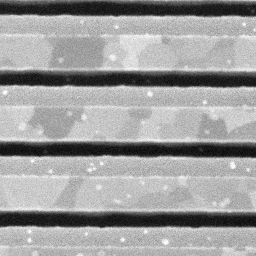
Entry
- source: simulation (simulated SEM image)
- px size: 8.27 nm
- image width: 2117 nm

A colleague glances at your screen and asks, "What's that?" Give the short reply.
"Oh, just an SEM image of lines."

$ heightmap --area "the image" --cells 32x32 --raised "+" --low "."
................................
................................
++++++++++++++++++++++++++++++++
++++++++++++++++++++++++++++++++
++++++++++++++++++++++++++++++++
++++++++++++++++++++++++++++++++
++++++++++++++++++++++++++++++++
++++++++++++++++++++++++++++++++
++++++++++++++++++++++++++++++++
................................
................................
++++++++++++++++++++++++++++++++
++++++++++++++++++++++++++++++++
++++++++++++++++++++++++++++++++
++++++++++++++++++++++++++++++++
++++++++++++++++++++++++++++++++
++++++++++++++++++++++++++++++++
++++++++++++++++++++++++++++++++
................................
................................
++++++++++++++++++++++++++++++++
++++++++++++++++++++++++++++++++
++++++++++++++++++++++++++++++++
++++++++++++++++++++++++++++++++
++++++++++++++++++++++++++++++++
++++++++++++++++++++++++++++++++
................................
................................
+++++..+..++........++..........
++++++++++++++++++++++++++++++++
++++++++++++++++++++++++++++++++
++++++++++++++++++++++++++++++++